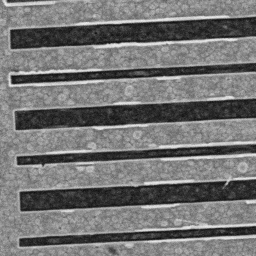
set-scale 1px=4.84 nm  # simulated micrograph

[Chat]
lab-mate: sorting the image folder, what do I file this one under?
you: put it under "parallel lines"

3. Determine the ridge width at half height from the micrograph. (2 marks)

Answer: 126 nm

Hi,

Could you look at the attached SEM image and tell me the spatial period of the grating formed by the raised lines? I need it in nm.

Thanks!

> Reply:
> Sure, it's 199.